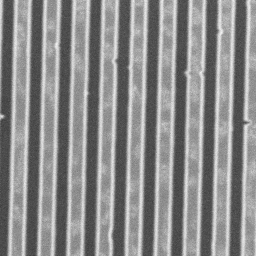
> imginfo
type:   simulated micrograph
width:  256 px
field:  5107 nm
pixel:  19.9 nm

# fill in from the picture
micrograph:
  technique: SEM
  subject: parallel lines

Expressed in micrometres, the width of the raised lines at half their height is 0.287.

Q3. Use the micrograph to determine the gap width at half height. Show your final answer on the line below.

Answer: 0.287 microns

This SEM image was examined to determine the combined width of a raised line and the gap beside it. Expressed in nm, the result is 580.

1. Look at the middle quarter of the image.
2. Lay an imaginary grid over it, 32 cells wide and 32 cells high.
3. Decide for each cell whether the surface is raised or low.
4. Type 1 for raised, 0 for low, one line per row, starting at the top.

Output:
00111100011110000111000011100001
00111100011110000111000011100001
00111100011110000111000011100001
00111100011110000111000011100001
00111000011110000111000011100001
00111000011110000111000011100001
00111000011110000111000011100001
00111100011110000111000011100001
00111000011110000111000011100001
00111000011110000111000011100001
00111000011110000111000011100001
00111000011110000111000011100001
00111000011100000111000011100001
00111000011100000111000011100001
00111000011100000111000011100001
00111000011100001111000011100001
00111000011100001111000011100001
00111000011100001111000011100001
00111000011100001111000011100001
00111000011100001111000011100001
00111000011100001111000011100001
00111000011100001111000011100001
00111000011100001110000011100001
00111000011100001110000111100001
00111000011100001110000111100001
00111000011100001110000111100001
00111000011100001110000111100001
01111000011100001110000111100001
00111000011100001110000111100001
00111000011100001110000111100001
01111000011100001110000111100011
01111000011100001110000111100011